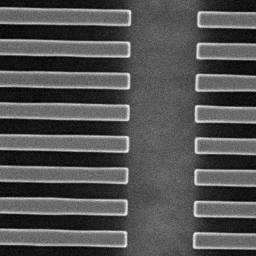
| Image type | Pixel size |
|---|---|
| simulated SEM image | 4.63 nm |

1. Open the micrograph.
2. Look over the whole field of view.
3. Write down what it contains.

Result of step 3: groups of lines, slits or small figures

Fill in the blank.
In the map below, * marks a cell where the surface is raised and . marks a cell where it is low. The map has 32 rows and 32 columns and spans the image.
................................
****************................
****************.........*******
...............................*
................................
****************.........******.
****************.........*******
................................
................................
****************.........*******
****************.........*******
................................
................................
****************.........*******
****************........********
................................
................................
****************.........*******
****************........********
................................
................................
****************.........*******
****************........********
................................
................................
****************........********
****************........********
................................
................................
****************........********
****************........********
................................